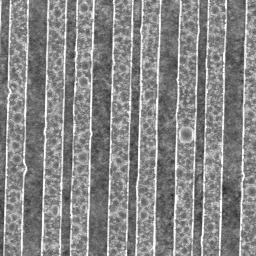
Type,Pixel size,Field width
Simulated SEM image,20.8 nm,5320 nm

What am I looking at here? parallel lines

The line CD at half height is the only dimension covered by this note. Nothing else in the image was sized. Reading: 376 nm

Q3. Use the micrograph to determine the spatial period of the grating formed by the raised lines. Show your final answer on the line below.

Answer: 686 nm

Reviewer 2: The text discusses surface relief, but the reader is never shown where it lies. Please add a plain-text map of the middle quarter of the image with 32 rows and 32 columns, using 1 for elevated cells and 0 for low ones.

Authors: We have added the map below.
00011110000011111001110000000101
00011110000011111001111000000111
00011110000011111001111000000111
00011110000011111001111000001111
00011110000011111001111000001111
00011110000011111001111000000111
00011110000011111001111000000111
00011110000011111001111000000111
00011110000011111001111000000111
00111110000011111001111000000111
00111110000011110001111000001111
00111110000011110001111000001111
00111110000011110001111000001111
00011110000011110001111000001111
00011110000011110001111000001111
00011110000011010001111000001111
00011110000011110001111000001111
00111110000011110001111000001111
00111110000011110001111000001111
00111110000011110001111000001111
00111100000011110001111000001111
00111100000011110001111000001111
00111100000011110001111000001111
00111100000011110001011000001111
00111100000011110001111000001111
00111100000011110001111000001111
00111100000011110001111000001111
00111100000011110001111000001111
00111100000111110001111000001111
00111100000111110011111000001111
00111100000111110011111000001101
00111100000111110011111000001111